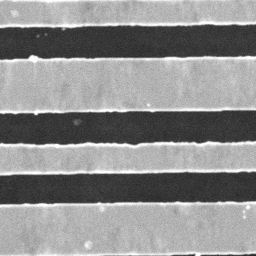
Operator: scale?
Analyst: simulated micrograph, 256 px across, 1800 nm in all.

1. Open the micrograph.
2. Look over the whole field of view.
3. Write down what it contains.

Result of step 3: lines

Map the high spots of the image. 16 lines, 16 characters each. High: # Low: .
################
################
................
................
################
################
################
................
................
################
################
................
................
################
################
################